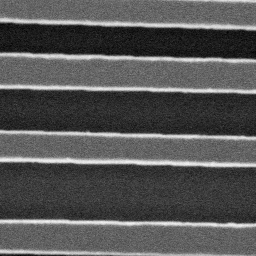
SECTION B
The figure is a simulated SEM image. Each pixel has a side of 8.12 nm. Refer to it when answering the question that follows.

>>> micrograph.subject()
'lines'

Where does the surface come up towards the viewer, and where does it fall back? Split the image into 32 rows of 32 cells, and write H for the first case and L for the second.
HHHHHHHHHHHHHHHHHHHHHHHHHHHHHHHH
HHHHHHHHHHHHHHHHHHHHHHHHHHHHHHHH
HHHHHHHHHHHHHHHHHHHHHHHHHHHHHHHH
LLLLLLLLLLLLLLLLLLLLLLLLLLLHHHHH
LLLLLLLLLLLLLLLLLLLLLLLLLLLLLLLL
LLLLLLLLLLLLLLLLLLLLLLLLLLLLLLLL
LLLLLLLLLLLLLLLLLLLLLLLLLLLLLLLL
HHHHHHHHHHHHHHHHHHHHHHHHHHHHHHLL
HHHHHHHHHHHHHHHHHHHHHHHHHHHHHHHH
HHHHHHHHHHHHHHHHHHHHHHHHHHHHHHHH
HHHHHHHHHHHHHHHHHHHHHHHHHHHHHHHH
LLLLLLLLLLLLLLLLLLLLLLLLLLHHHHHH
LLLLLLLLLLLLLLLLLLLLLLLLLLLLLLLL
LLLLLLLLLLLLLLLLLLLLLLLLLLLLLLLL
LLLLLLLLLLLLLLLLLLLLLLLLLLLLLLLL
LLLLLLLLLLLLLLLLLLLLLLLLLLLLLLLL
HHHHHLLLLLLLLLLLLLLLLLLLLLLLLLLL
HHHHHHHHHHHHHHHHHHHHHHHHHHHHHHHH
HHHHHHHHHHHHHHHHHHHHHHHHHHHHHHHH
HHHHHHHHHHHHHHHHHHHHHHHHHHHHHHHH
LLLLLLLLLLLLLLLLLLHHHHHHHHHHHHHH
LLLLLLLLLLLLLLLLLLLLLLLLLLLLLLLL
LLLLLLLLLLLLLLLLLLLLLLLLLLLLLLLL
LLLLLLLLLLLLLLLLLLLLLLLLLLLLLLLL
LLLLLLLLLLLLLLLLLLLLLLLLLLLLLLLL
LLLLLLLLLLLLLLLLLLLLLLLLLLLLLLLL
LLLLLLLLLLLLLLLLLLLLLLLLLLLLLLLL
LLLLLLLLLLLLLLLLLLLLLLLLLLLLLLLL
HHHHHHHHHHHHHHHHHHHHHHHHHHHHHHHH
HHHHHHHHHHHHHHHHHHHHHHHHHHHHHHHH
HHHHHHHHHHHHHHHHHHHHHHHHHHHHHHHH
HHHHHHHHHHHHHHHHHHHHHHHHHHHHHHHH